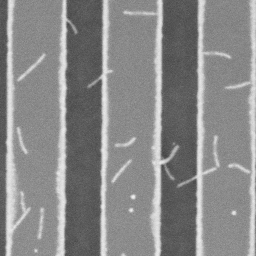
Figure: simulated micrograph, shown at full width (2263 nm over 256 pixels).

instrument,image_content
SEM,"lines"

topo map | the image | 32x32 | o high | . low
.ooooooo.....ooooooo.....ooooooo
.ooooooo.....ooooooo.....ooooooo
.ooooooo.....ooooooo.....ooooooo
.ooooooo.....ooooooo.....ooooooo
.ooooooo.....ooooooo.....ooooooo
.ooooooo.....ooooooo.....ooooooo
.ooooooo.....ooooooo.....ooooooo
.ooooooo.....ooooooo.....ooooooo
.ooooooo.....ooooooo.....ooooooo
.ooooooo.....ooooooo.....ooooooo
.ooooooo.....ooooooo.....ooooooo
.ooooooo.....ooooooo.....ooooooo
.ooooooo.....ooooooo.....ooooooo
.ooooooo.....ooooooo.....ooooooo
.ooooooo.....ooooooo.....ooooooo
.ooooooo.....ooooooo.....ooooooo
.ooooooo.....ooooooo.....ooooooo
.ooooooo.....ooooooo.....ooooooo
.ooooooo.....ooooooo.....ooooooo
.ooooooo.....ooooooo.....ooooooo
.ooooooo.....ooooooo.....ooooooo
.ooooooo.....ooooooo.....ooooooo
.ooooooo.....ooooooo.....ooooooo
.ooooooo.....ooooooo.....ooooooo
.ooooooo.....ooooooo.....ooooooo
.ooooooo.....ooooooo.....ooooooo
.ooooooo.....ooooooo.....ooooooo
.ooooooo.....ooooooo.....ooooooo
.ooooooo.....ooooooo.....ooooooo
.ooooooo.....ooooooo.....ooooooo
.ooooooo.....ooooooo.....ooooooo
.ooooooo.....ooooooo.....ooooooo